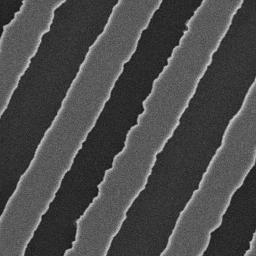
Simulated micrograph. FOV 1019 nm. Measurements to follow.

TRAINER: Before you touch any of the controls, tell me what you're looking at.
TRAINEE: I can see lines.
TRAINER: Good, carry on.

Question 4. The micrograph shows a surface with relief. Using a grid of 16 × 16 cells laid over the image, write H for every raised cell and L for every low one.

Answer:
LHHHLLLHHHLLHHHL
HHHLLLLHHLLLHHLL
HHHLLLHHHLLHHHLL
HHLLLHHHLLLHHLLL
HHLLLHHHLLHHHLLL
HLLLHHHLLHHHLLLL
LLLLHHHLLHHHLLLH
LLLHHHLLLHHLLLHH
LLLHHLLLHHHLLLHH
LLHHHLLHHHLLLLHH
LLHHLLLHHHLLLHHH
LHHHLLHHHLLLHHHL
LHHLLLHHLLLLHHLL
HHHLLHHHLLLHHHLL
HHLLLHHLLLLHHLLL
HHLLHHHLLLHHHLLL